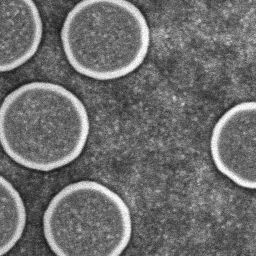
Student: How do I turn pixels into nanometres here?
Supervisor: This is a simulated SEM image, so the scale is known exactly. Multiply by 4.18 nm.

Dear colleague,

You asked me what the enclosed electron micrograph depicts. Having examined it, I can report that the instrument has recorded raised bodies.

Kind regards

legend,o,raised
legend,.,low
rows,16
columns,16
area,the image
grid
oo...ooo........
oo..ooooo.......
oo..ooooo.......
oo..ooooo.......
.....ooo........
..o.............
ooooo...........
ooooo.........oo
ooooo........ooo
.oooo........ooo
..............oo
...............o
o..oooo.........
o..ooooo........
o..ooooo........
...ooooo........